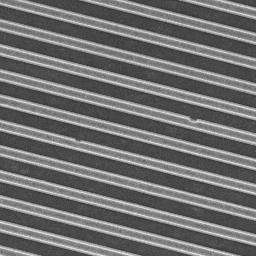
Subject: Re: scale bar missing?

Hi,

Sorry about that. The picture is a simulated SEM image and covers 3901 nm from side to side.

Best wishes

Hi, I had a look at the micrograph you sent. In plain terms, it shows parallel lines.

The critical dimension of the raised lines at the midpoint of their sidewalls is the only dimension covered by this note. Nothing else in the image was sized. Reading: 0.146 µm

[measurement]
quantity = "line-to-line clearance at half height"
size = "0.224 um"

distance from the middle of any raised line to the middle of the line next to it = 0.372 um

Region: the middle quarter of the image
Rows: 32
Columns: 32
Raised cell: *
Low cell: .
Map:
*****...............**********..
*********...............********
...**********...............****
.......**********...............
...........**********...........
...............**********.......
****...............**********...
********...............*********
..**********...............*****
......**********...............*
..........**********............
..............**********........
**................**********....
******................*********.
.**********...............******
.....**********...............**
.........**********.............
............***********.........
*...............***********.....
*****...............**********..
*********...............********
....*********...............****
........*********...............
............*********...........
...............**********.......
****...............**********...
********...............*********
...*********...............*****
.......*********...............*
...........*********............
...............*********........
***...............**********....